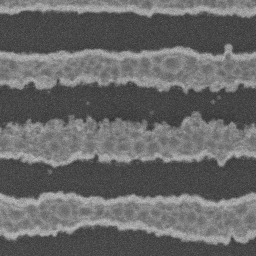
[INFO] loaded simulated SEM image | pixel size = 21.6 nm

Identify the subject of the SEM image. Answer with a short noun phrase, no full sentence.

one or a few lines or trenches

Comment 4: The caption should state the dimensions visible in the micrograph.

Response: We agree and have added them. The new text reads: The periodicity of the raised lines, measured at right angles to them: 1580 nm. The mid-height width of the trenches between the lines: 965 nanometres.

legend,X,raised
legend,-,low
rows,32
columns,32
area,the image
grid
XXXXXXXXXXXXXXXXXXXXXXXXXXXXXXXX
------------------X-----------XX
--------------------------------
--------------------------------
--------------------------------
--------------------------------
-----------X--------XXX-----X---
XXXXXXXXXXXXXXXXXXXXXXXXXXXXXXXX
XXXXXXXXXXXXXXXXXXXXXXXXXXXXXXXX
XXXXXXXXXXXXXXXXXXXXXXXXXXXXXXXX
--X--XX----------------XXXXXX--X
--------------------------------
--------------------------------
--------------------------------
--------------------------------
------X---XX-XXXX------XXXXX----
XXX--XXX-XXXXXXXXX--XXXXXXXXX--X
XXXXXXXXXXXXXXXXXXXXXXXXXXXXXXXX
XXXXXXXXXXXXXXXXXXXXXXXXXXXXXXXX
---XXXXXX-XX-XXXXXXXXXXXX--XX---
--------------------------------
--------------------------------
--------------------------------
--------------------------------
-------X------------------------
XXXXXXXXXXXXXXXXXXXXXXXXXX-XXXXX
XXXXXXXXXXXXXXXXXXXXXXXXXXXXXXXX
XXXXXXXXXXXXXXXXXXXXXXXXXXXXXXXX
XXXXXXX-X----------XXXXXXXXXXXXX
-X---------------------XXXXXXXX-
--------------------------------
--------------------------------